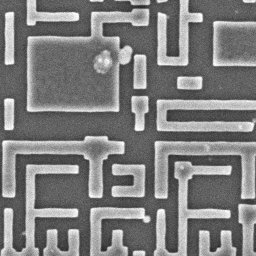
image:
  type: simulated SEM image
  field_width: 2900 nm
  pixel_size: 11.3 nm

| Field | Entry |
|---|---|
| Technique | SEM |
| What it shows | wiring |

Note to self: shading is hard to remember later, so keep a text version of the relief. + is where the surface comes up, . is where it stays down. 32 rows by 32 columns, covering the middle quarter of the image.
++++++++++++++....++............
++++++++++++++....++............
++++++++++++++....++............
++++++++++++++....++.........+++
++++++++++++++....++.........+++
++++++++++++++....++.........+++
++++++++++++++..................
++++++++++++++..................
++++++++++++++...++++...........
++++++++++++++...++++..+++++++++
++++++++++++++...++++..+++++++++
++++++++++++++...++++..+++......
..................++...++.......
..................++...++.......
..................++...+++......
..................++...+++++++++
..................++...+++++++++
................................
.....++++++.....................
++++++++++++++.........+++......
+++++++++++++++........+++++++++
+++++++++++++++........+++++++++
....+++++++............++++.++++
.....++++++............+++......
......++++.............+++..+++.
++.....++...++++++++...+++..++++
+++....++...++++++++...+++..++++
......+++....+++.+++...+++..++++
......+++.........++...+++..++++
......+++.........++...+++...++.
......++++.......+++...+++...++.
......++++..++++++++...+++...++.